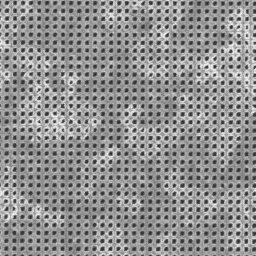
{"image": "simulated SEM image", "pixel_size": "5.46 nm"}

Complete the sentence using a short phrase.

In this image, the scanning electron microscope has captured a regular array of holes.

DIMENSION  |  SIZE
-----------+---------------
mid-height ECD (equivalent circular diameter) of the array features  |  24.7 nm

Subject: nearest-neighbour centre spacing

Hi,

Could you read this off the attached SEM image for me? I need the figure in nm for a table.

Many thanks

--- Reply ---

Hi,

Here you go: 40.7